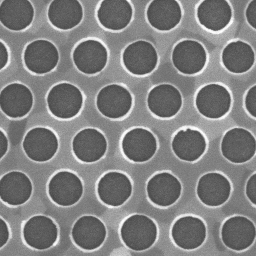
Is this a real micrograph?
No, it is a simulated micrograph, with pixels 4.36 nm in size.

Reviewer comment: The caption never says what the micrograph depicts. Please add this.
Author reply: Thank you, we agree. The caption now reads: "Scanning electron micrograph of a regular array of holes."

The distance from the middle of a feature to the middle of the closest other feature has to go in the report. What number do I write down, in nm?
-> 214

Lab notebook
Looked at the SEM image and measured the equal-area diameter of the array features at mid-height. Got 152 nanometers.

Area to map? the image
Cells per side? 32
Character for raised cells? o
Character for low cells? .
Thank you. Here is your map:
....oo....ooo...ooo...ooo....oo.
....oo....oo.....o.....oo....oo.
....oo....oo....ooo....oo....oo.
o..oooo..oooo...ooo...oooo..oooo
oooooooooooooooooooooooooooooooo
oooo...ooo...ooo...ooo...oooo..o
.oo....oo....oo.....oo....oo....
.oo....oo....oo.....oo....oo....
ooo....ooo...ooo...ooo...ooo...o
oooooooooooooooooooooooooooooooo
o..oooo..ooooooooooooooooo.ooooo
....oo....oo....ooo...ooo....oo.
....oo....oo.....o.....oo....oo.
....oo....oo....oo.....oo....oo.
o..oooo..oooo...oooo..ooo...oooo
oooooooooooooooooooooooooooooooo
oooo...ooo..oooo...ooo...ooo...o
.oo....oo....oo.....oo....oo....
.oo....oo....oo.....o.....oo....
ooo....oo....ooo...ooo...ooo....
oooooooooooooooooooooooooooooooo
o..oooo..ooooooooooooooooooooooo
....oo....ooo...ooo...ooo...ooo.
....oo....oo....oo.....oo....oo.
....oo....oo....oo.....oo....oo.
o..oooo..oooo..oooo...oooo..oooo
oooooooooooooooooooooooooooooooo
oooo..oooo...ooo...ooo...ooo...o
.oo....oo....oo.....o.....oo....
.oo....oo....oo.....o.....oo....
.oo....ooo...ooo...ooo...ooo....
oooooooooooooooooooooooooooooooo